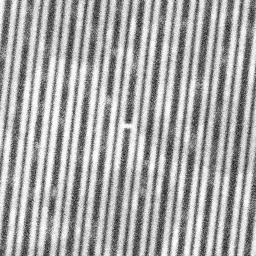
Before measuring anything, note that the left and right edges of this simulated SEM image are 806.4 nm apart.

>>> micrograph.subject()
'parallel lines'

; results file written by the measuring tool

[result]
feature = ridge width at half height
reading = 13.3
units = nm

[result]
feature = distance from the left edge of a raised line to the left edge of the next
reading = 34.7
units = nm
